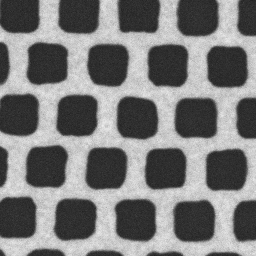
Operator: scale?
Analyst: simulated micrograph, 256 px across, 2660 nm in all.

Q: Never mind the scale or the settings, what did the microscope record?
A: a regular array of holes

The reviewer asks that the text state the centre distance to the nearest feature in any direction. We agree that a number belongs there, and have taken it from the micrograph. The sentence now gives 615 nm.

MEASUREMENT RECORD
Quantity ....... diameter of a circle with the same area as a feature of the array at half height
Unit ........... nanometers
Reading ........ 462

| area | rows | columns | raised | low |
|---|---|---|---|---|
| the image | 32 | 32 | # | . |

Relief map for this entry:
.....##......##.....##.....###..
.....##.....###.....##.....###..
.....##.....###.....##.....###..
.....###....###.....##.....###..
########################..#####.
.###...#####..#######.##########
.##.....###.....###....###.....#
.###....###.....##......##.....#
.##......##.....###....###.....#
.##.....###.....##.....###.....#
####.#######...####....####....#
################################
.....###....###....####....###..
.....##.....###.....##.....###..
.....##.....###.....##.....###..
.....##.....###.....##.....###..
....###.....###.....##.....###..
################################
####....####..##################
.##.....###.....##.....###.....#
.##.....###.....##.....###.....#
.##.....###.....##.....###.....#
.##.....###.....##.....###.....#
######.#####...####...####....##
################################
....###.....###....###....####..
.....##.....##......##.....##...
.....##.....##......##.....##...
.....##.....##......##.....##...
....###....####....###.....##...
################################
####....###....######.#####..###